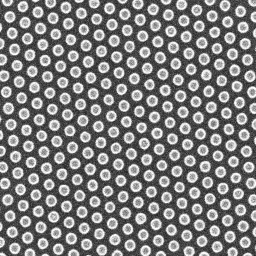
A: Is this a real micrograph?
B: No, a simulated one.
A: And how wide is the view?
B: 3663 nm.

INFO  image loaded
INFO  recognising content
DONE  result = a regular array of raised bodies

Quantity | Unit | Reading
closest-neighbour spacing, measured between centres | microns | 0.231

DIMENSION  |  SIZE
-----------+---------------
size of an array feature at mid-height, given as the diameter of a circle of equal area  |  144 nm